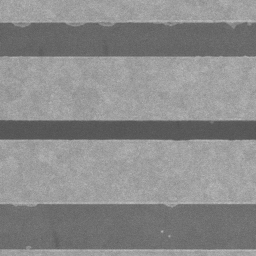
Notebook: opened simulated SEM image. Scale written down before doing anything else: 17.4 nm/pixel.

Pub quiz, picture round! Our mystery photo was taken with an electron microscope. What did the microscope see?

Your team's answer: lines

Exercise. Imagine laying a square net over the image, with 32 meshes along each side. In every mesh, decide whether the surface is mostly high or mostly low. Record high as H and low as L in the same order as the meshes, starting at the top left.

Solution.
HHHHHHHHHHHHHHHHHHHHHHHHHHHHHHHH
HHHHHHHHHHHHHHHHHHHHHHHHHHHHHHHH
HHHHHHHHHHHHHHHHHHHHHHHHHHHHHHHH
LLLLLLLLLLLLLLLLLLLLLLLLLLLLLLLL
LLLLLLLLLLLLLLLLLLLLLLLLLLLLLLLL
LLLLLLLLLLLLLLLLLLLLLLLLLLLLLLLL
LLLLLLLLLLLLLLLLLLLLLLLLLLLLLLLL
HHHHHHHHHHHHHHHHHHHHHHHHHHHHHHHH
HHHHHHHHHHHHHHHHHHHHHHHHHHHHHHHH
HHHHHHHHHHHHHHHHHHHHHHHHHHHHHHHH
HHHHHHHHHHHHHHHHHHHHHHHHHHHHHHHH
HHHHHHHHHHHHHHHHHHHHHHHHHHHHHHHH
HHHHHHHHHHHHHHHHHHHHHHHHHHHHHHHH
HHHHHHHHHHHHHHHHHHHHHHHHHHHHHHHH
HHHHHHHHHHHHHHHHHHHHHHHHHHHHHHHH
LLLLLLLLLLLLLLLLLLLLLLLLLLLLLLLL
LLLLLLLLLLLLLLLLLLLLLLLLLLLLLLLL
LLLLLLLLLLLLLLLLLLLLLLLLLLLLLLLL
HHHHHHHHHHHHHHHHHHHHHHHHHHHHHHHH
HHHHHHHHHHHHHHHHHHHHHHHHHHHHHHHH
HHHHHHHHHHHHHHHHHHHHHHHHHHHHHHHH
HHHHHHHHHHHHHHHHHHHHHHHHHHHHHHHH
HHHHHHHHHHHHHHHHHHHHHHHHHHHHHHHH
HHHHHHHHHHHHHHHHHHHHHHHHHHHHHHHH
HHHHHHHHHHHHHHHHHHHHHHHHHHHHHHHH
LLLLLLLLLLLLLLLLLLLLLLLLLLLLLLLL
LLLLLLLLLLLLLLLLLLLLLLLLLLLLLLLL
LLLLLLLLLLLLLLLLLLLLLLLLLLLLLLLL
LLLLLLLLLLLLLLLLLLLLLLLLLLLLLLLL
LLLLLLLLLLLLLLLLLLLLLLLLLLLLLLLL
LLLLLLLLLLLLLLLLLLLLLLLLLLLLLLLL
HHHHHHHHHHHHHHHHHHHHHHHHHHHHHHHH